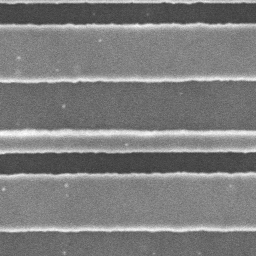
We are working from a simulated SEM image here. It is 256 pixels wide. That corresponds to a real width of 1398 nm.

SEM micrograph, lines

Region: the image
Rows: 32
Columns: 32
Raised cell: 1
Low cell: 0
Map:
00000000000000000000000000000000
00000000000000000000000000000000
00000000000000000000000000000000
11111111111111111111111111111111
11111111111111111111111111111111
11111111111111111111111111111111
11111111111111111111111111111111
11111111111111111111111111111111
11111111111111111111111111111111
11111111111111111111111111111111
00000000000000000000000000000000
00000000000000000000000000000000
00000000000000000000000000000000
00000000000000000000000000000000
00000000000000000000000000000000
00000000000000000000000000000000
00000000000000000000000000000000
11111111111111111111111111111111
11111111111111111111111111111111
00000000000000000000000000000000
00000000000000000000000000000000
00000000000000000000000000000000
11111111111111111111111111111111
11111111111111111111111111111111
11111111111111111111111111111111
11111111111111111111111111111111
11111111111111111111111111111111
11111111111111111111111111111111
11111111111111111111111111111111
00000000000000000000000000000000
00000000000000000000000000000000
00000000000000000000000000000000